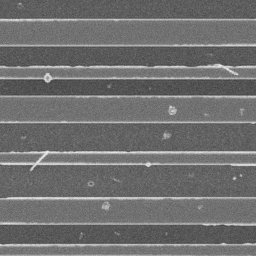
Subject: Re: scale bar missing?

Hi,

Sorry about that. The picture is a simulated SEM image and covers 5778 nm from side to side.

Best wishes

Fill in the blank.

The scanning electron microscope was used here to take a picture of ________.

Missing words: lines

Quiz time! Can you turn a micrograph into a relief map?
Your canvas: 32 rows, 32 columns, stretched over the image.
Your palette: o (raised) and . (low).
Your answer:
................................
................................
oooooooooooooooooooooooooooooooo
oooooooooooooooooooooooooooooooo
oooooooooooooooooooooooooooooooo
oooooooooooooooooooooooooooooooo
................................
................................
oooooooooooooooooooooooooooooooo
oooooooooooooooooooooooooooooooo
................................
................................
oooooooooooooooooooooooooooooooo
oooooooooooooooooooooooooooooooo
oooooooooooooooooooooooooooooooo
................................
................................
................................
................................
oooooooooooooooooooooooooooooooo
oooooooooooooooooooooooooooooooo
................................
................................
................................
................................
oooooooooooooooooooooooooooooooo
oooooooooooooooooooooooooooooooo
oooooooooooooooooooooooooooooooo
................................
................................
...........................oo.oo
oooooooooooooooooooooooooooooooo